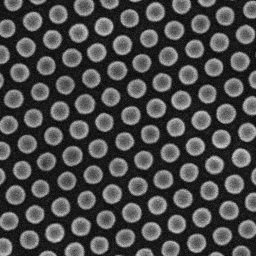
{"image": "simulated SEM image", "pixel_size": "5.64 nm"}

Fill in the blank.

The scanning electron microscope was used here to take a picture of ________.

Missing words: a regular array of raised bodies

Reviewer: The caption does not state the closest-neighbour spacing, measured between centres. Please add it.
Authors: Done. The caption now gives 147 nm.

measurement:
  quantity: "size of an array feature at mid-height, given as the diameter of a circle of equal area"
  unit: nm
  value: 103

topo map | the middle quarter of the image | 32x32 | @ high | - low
-@@--------@@@@--@@@@@--------@-
------@----@@@@@--@@@--------@@@
-----@@@@--@@@@---------@----@@@
@@---@@@@---@@@--------@@@@--@@@
@@---@@@@--------@@@--@@@@@---@@
@@@---@@--------@@@@--@@@@@-----
@@---------@@---@@@@---@@@------
@---------@@@@--@@@@--------@@@-
---@@@@--@@@@@-------------@@@@@
---@@@@@--@@@--------@@@@--@@@@@
@--@@@@@-------------@@@@--@@@@-
@--@@@@--------@@@@--@@@@-------
@--------@@----@@@@--@@@@-------
--------@@@@---@@@@-------------
---@@---@@@@---@@@--------@@@@--
--@@@@--@@@@---------@----@@@@--
-@@@@@---@@---------@@@@--@@@@--
--@@@@--------@@@--@@@@@--@@@---
---@@--------@@@@---@@@@--------
-------@@@---@@@@---@@@--------@
------@@@@@--@@@@--------@@@---@
@@@@--@@@@@-------------@@@@@--@
@@@@@--@@@--------@@@@--@@@@@---
@@@@--------------@@@@---@@@----
@@@@--------@@@---@@@@----------
-------@---@@@@@--@@@---------@@
-----@@@@--@@@@@-------------@@@
@@---@@@@@--@@@--------@@@@--@@@
@@@--@@@@---------@----@@@@--@@@
@@@---@@--------@@@@---@@@@-----
@@@--------@@---@@@@@--@@@------
----------@@@@--@@@@@--------@@-